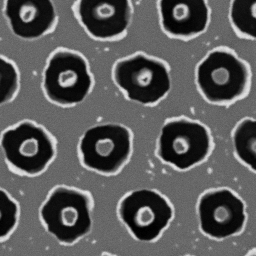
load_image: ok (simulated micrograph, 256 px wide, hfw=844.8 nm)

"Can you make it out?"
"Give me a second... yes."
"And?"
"a regular array of ring-shaped grooves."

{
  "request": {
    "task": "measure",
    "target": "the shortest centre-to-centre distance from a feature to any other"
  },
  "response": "75.6 pixels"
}